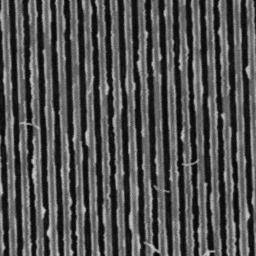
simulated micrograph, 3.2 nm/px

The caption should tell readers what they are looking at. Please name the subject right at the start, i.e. parallel lines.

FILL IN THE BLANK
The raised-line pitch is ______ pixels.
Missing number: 13.6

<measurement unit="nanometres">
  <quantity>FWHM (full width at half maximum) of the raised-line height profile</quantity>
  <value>24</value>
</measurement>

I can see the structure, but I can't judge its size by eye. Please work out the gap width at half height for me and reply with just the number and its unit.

18 nm